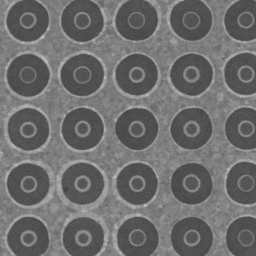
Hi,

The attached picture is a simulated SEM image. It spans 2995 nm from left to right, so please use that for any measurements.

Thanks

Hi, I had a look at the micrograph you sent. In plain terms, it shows an array of small figures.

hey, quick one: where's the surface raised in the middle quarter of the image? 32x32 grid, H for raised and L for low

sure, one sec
LLLLLLLLLLHHHLLLLLLLLLLHHHHLLLLL
LLLHHHLLLLHHHLLLLHHLLLLLHHLLLLHH
LLLHHHHLLLHHLLLLLHHHLLLLHHLLLLHH
LLLHHHHLLLHHHLLLLHHHLLLLHHLLLLLH
LLLLHLLLLLHHHLLLLLLLLLLHHHLLLLLL
LLLLLLLLLLHHHLLLLLLLLLLHHHHLLLLL
LLLLLLLLLHHHHHLLLLLLLLHHHHHHLLLL
HHLLLLLHHHHHHHHLLLLLLHHHHHHHHLLL
HHHHHHHHHHHHHHHHHHLHHHHHHHHHHHHH
HHHHHHHHHHHHHHHHHHHHHHHHHHHHHHHH
HHHHHHHHHHHHHHHHHHHHHHHHHHHHHHHH
HHLLLLLLHHHHHHHLLLLLLHHHHHHHHLLL
HLLLLLLLLHHHHHLLLLLLLLHHHHHHLLLL
LLLLLLLLLHHHHLLLLLLLLLLHHHHLLLLL
LLLLHLLLLLHHHLLLLLLLLLLLHHHLLLLL
LLLHHHLLLLHHHLLLLHHHLLLLHHLLLLLH
LLLHHHLLLLHHHLLLHHHHLLLLHHLLLLHH
LLLLHHLLLLHHHLLLLHHHLLLLHHHLLLLH
LLLLLLLLLLHHHLLLLLLLLLLHHHHLLLLL
LLLLLLLLLHHHHHLLLLLLLLHHHHHHLLLL
HLLLLLLLHHHHHHHLLLLLLHHHHHHHHLLL
HHHLLLLHHHHHHHHHHLLLHHHHHHHHHHHH
HHHHHHHHHHHHHHHHHHHHHHHHHHHHHHHH
HHHHHHHHHHHHHHHHHHHHHHHHHHHHHHHH
HHHLLLHHHHHHHHHHHLLLHHHHHHHHHHHH
LLLLLLLLHHHHHHHLLLLLLLHHHHHHHLLL
LLLLLLLLLHHHHHLLLLLLLLHHHHHHLLLL
LLLLLLLLLLHHHLLLLLLLLLLHHHHLLLLL
LLLLHLLLLLHHHLLLLHHLLLLHHHHLLLHH
LLLHHHLLLLLHHLLLLHHHLLLLHHHLLLHH
LLLHHHLLLLLHHLLLLHHHLLLLHHHLLLHH
LLLLHLLLLLHHHLLLLHHLLLLHHHHLLLLH